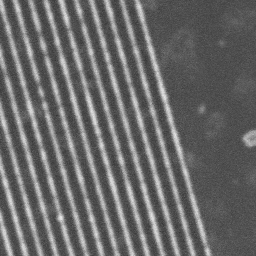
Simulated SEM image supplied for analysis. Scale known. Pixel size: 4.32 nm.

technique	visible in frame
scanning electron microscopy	parallel lines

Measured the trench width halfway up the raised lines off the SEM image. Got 54.1 nm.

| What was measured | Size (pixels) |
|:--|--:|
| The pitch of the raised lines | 14.7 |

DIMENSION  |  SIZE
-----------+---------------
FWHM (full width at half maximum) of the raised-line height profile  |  11.4 nanometres